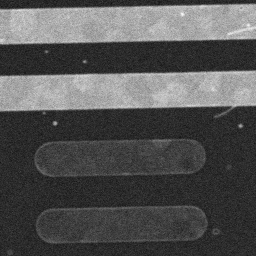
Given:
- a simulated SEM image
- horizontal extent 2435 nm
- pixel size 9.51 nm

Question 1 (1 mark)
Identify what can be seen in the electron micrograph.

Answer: groups of lines, slits or small figures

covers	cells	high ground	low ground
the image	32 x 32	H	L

LLLLLLLLLLLLLLLLLLLLLLLLLLLLLLLL
HHHHHHHHHHHHHHHHHHHHHHHHHHHHHHHH
HHHHHHHHHHHHHHHHHHHHHHHHHHHHHHHH
HHHHHHHHHHHHHHHHHHHHHHHHHHHHHHHH
HHHHHHHHHHHHHHHHHHHHHHHHHHHHHHHH
LLLLLLLLLLLLLLLLLLLLLLLLLLLLLLLL
LLLLLLLLLLLLLLLLLLLLLLLLLLLLLLLL
LLLLLLLLLLLLLLLLLLLLLLLLLLLLLLLL
LLLLLLLLLLLLLLLLLLLLLLLLLLLLLLLL
LLLLLLLHHHHHHHHHHHHHHHHHHHHHHHHH
HHHHHHHHHHHHHHHHHHHHHHHHHHHHHHHH
HHHHHHHHHHHHHHHHHHHHHHHHHHHHHHHH
HHHHHHHHHHHHHHHHHHHHHHHHHHHHHHHH
HHHHHHHHHHHHLLLLLLLLLLLLLLLLLLLL
LLLLLLLLLLLLLLLLLLLLLLLLLLLLLLLL
LLLLLLLLLLLLLLLLLLLLLLLLLLLLLLLL
LLLLLLLLLLLLLLLLLLLLLLLLLLLLLLLL
LLLLLLLLLLLLLLLLLLLLLHHHLLLLLLLL
LLLLLHHHHHHHHHHHHHHHHHHHHLLLLLLL
LLLLHHHHHHHHHHHHHHHHHHHHHHLLLLLL
LLLLLHHHHHHHHHHHHHHHHHHHHLLLLLLL
LLLLLHHHHHHHHHHHHHHHHHHHLLLLLLLL
LLLLLLLLLLLLLLLLLLLLLLLLLLLLLLLL
LLLLLLLLLLLLLLLLLLLLLLLLLLLLLLLL
LLLLLLLLLLLLLLLLLLLLLLLLLLLLLLLL
LLLLLLLLLLLLLLLLLLLLLLLLLLLLLLLL
LLLLLLHHHHHHHHHHHHHHHHHHHLLLLLLL
LLLLLHHHHHHHHHHHHHHHHHHHHHLLLLLL
LLLLLHHHHHHHHHHHHHHHHHHHHHLLLLLL
LLLLLHHHHHHHHHHHHHHHHHHHHLLLLLLL
LLLLLLLLLLLLLLLLLLLLLLLLLLLLLLLL
LLLLLLLLLLLLLLLLLLLLLLLLLLLLLLLL